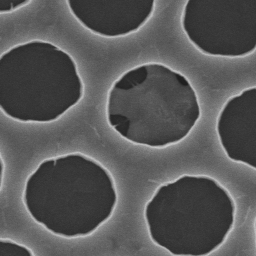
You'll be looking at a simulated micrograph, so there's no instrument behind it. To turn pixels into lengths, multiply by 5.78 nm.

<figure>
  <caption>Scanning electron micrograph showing holes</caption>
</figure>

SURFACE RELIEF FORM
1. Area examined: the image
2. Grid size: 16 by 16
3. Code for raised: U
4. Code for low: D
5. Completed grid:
DUUUDDDDDUUUDDDD
UUUUUDDDDUUDDDDD
UUUUUUUUUUUUDDDD
DDDDUUUUUUUUUUUU
DDDDDUUUDDDUUUUU
DDDDDUUDDDDDUUUU
DDDDDUUDDDDDUUDD
UDDUUUUDDDDDUUDD
UUUUUUUUDDDUUUDD
UUUUUUUUUUUUUUDD
UUDDDDUUUUUUUUUU
UUDDDDDUUUUDDDUU
UUDDDDDUUDDDDDUU
UUDDDDDUUDDDDDDU
UUUDDDUUUDDDDDUU
DUUUUUUUUUDDDUUU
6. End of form